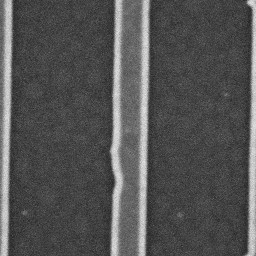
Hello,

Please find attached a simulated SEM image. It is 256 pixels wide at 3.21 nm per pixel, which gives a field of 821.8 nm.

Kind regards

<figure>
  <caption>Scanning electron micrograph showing one or a few lines or trenches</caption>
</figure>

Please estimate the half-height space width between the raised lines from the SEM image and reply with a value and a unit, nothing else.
353 nm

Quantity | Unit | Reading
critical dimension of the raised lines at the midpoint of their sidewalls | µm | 0.09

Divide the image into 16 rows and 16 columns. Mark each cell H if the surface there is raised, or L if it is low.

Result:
HLLLLLLHHLLLLLLL
HLLLLLLHHLLLLLLL
HLLLLLLHHLLLLLLL
LLLLLLLHHLLLLLLL
LLLLLLLHHLLLLLLL
LLLLLLLHHLLLLLLL
LLLLLLLHHLLLLLLL
LLLLLLLHHLLLLLLL
LLLLLLLHHLLLLLLL
LLLLLLLHHLLLLLLL
LLLLLLLHHLLLLLLL
LLLLLLLHHLLLLLLL
LLLLLLLHHLLLLLLL
LLLLLLLHHLLLLLLL
LLLLLLLHHLLLLLLL
LLLLLLLHHLLLLLLL